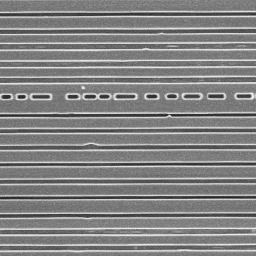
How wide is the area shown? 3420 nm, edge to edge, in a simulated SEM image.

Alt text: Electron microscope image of parallel lines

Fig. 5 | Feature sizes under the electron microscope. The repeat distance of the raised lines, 223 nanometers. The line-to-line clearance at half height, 58.4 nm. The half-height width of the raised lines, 162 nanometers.